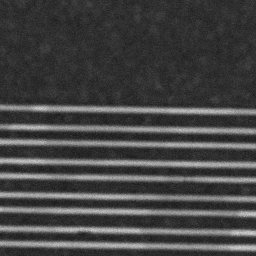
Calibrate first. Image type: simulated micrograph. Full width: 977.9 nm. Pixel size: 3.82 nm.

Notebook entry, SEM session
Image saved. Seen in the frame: parallel lines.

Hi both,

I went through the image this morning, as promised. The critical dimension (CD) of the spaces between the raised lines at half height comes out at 50.9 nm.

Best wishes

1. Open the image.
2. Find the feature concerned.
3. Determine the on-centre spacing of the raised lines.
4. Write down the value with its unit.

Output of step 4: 0.0649 um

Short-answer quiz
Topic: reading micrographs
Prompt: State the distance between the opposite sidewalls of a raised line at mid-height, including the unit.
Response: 14.8 nanometres